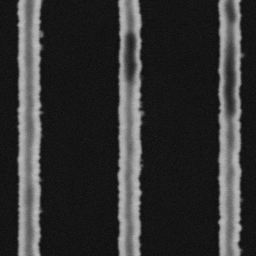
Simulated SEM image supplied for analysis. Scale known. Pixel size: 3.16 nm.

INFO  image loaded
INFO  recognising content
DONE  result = lines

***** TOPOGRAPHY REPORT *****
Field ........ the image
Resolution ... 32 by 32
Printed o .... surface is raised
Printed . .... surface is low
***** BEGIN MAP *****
..ooo..........oo..........ooo..
..ooo..........oo...........oo..
..ooo..........oo...........oo..
..ooo..........oo...........oo..
..ooo..........oo...........oo..
..ooo..........ooo..........oo..
..ooo..........oo...........oo..
..ooo..........oo...........oo..
..ooo..........ooo..........oo..
..ooo..........oo...........oo..
..ooo..........oo...........oo..
..ooo..........oo..........ooo..
...oo..........oo...........oo..
..ooo..........oo...........oo..
..ooo..........oo...........oo..
..ooo..........oo...........oo..
...oo..........oo...........oo..
...oo..........oo...........oo..
...oo..........oo...........oo..
..ooo..........oo...........oo..
..ooo..........oo...........oo..
..ooo..........oo...........oo..
...oo..........oo...........oo..
...oo..........oo...........oo..
...oo..........oo...........oo..
...oo..........oo...........oo..
...oo..........oo...........oo..
..ooo..........oo...........oo..
..ooo..........oo...........oo..
..ooo..........oo...........oo..
..ooo..........oo...........oo..
..ooo..........oo...........oo..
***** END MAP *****